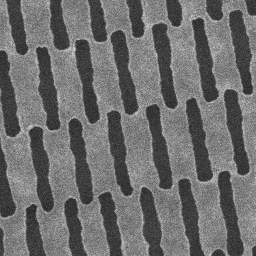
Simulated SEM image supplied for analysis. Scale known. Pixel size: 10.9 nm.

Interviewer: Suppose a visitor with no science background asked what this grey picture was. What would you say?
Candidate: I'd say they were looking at a regular array of holes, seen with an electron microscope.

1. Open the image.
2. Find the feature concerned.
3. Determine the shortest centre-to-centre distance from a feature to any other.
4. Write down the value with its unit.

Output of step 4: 0.43 microns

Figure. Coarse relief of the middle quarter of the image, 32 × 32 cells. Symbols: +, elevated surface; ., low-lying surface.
+++....++++++...++++++++...+++++
+++....++++++...++++++++...+++++
++++...++++++....+++++++...+++++
++++...+++++++...+++++++...+++++
++++...+++++++...+++++++...+++++
++++...+++++++....++++++....++++
++++....++++++....++++++....++++
+++++...++++++....++++++....++++
+++++...++++++....+++++++...++++
+++++...+++++++...+++++++...++..
+++++....++++++....++...+...+++.
+++++....++++++...++....++++++..
+++++....++...++.+++....+++++++.
++++++...++...+++++++...+++++++.
+...++..+++...+++++++...+++++++.
+....++++++...+++++++...+++++++.
+....++++++....++++++....++++++.
+....++++++....+++++++...++++++.
++...++++++....+++++++...+++++++
+....++++++....+++++++....++++++
+....++++++....+++++++....++++++
++...++++++.....++++++....++++++
++....++++++....++++++....++++++
+++...++++++....++++++....++++++
+++...++++++...+++++++.....+++++
+++...++++++....+++++++....+++++
+++....++++++...+++++++....+++++
+++....++++++...+++++++....+++++
+++....++++++...++++++++...+++++
+++....++++++....+++++++...++...
+++....+++++++...+++++++...+....
+++....+++++++...++..++++++++...